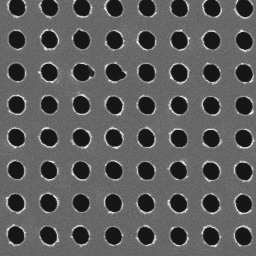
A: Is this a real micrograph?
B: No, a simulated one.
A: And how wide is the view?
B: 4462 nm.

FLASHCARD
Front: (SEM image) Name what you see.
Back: a regular array of holes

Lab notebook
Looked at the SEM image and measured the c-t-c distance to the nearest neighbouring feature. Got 562 nm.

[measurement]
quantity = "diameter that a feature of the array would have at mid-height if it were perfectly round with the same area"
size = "302 nanometres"